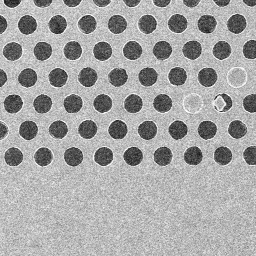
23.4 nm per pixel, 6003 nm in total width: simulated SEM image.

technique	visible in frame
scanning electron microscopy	a regular array of holes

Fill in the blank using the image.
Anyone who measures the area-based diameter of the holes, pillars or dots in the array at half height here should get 459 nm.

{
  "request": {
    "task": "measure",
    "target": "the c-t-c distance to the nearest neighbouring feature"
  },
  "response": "0.687 µm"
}